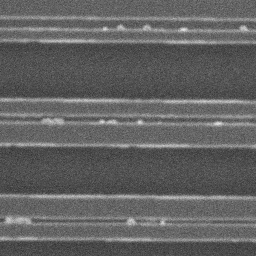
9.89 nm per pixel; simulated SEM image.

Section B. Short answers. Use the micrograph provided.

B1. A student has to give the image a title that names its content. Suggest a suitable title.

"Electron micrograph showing lines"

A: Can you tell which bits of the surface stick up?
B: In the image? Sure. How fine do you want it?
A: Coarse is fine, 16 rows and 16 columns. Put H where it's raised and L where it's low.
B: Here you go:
HHHHHHHHHHHHHHHH
HHHHHHHHHHHHHHHH
HHHHHHHHHHHHHHHH
LLLLLLLLLLLLLLLL
LLLLLLLLLLLLLLLL
LLLLLLLLLLLLLLLL
HHHHHHHHHHHHHHHH
HHHHHHHHHHHHHHHH
HHHHHHHHHHHHHHHH
LLLLLLLLLLLLLLLL
LLLLLLLLLLLLLLLL
LLLLLLLLLLLLLLLL
HHHHHHHHHHHHHHHH
HHHHHHHHHHHHHHHH
HHHHHHHHHHHHHHHH
LLLLLLLLLLLLLLLL